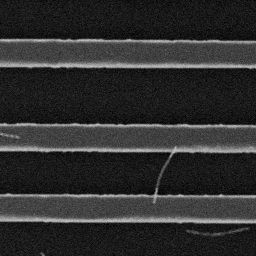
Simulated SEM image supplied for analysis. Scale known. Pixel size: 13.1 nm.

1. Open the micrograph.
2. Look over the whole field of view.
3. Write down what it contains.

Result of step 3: lines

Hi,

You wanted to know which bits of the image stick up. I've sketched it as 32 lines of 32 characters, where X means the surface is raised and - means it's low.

--------------------------------
--------------------------------
--------------------------------
--------------------------------
--------------------------------
XXXXXXXXXXXXXXXXXXXXXXXXXXXXXXXX
XXXXXXXXXXXXXXXXXXXXXXXXXXXXXXXX
XXXXXXXXXXXXXXXXXXXXXXXXXXXXXXXX
--------------------------------
--------------------------------
--------------------------------
--------------------------------
--------------------------------
--------------------------------
--------------------------------
X-XXX----X--X-------------------
XXXXXXXXXXXXXXXXXXXXXXXXXXXXXXXX
XXXXXXXXXXXXXXXXXXXXXXXXXXXXXXXX
XXXXXXXXXXXXXXXXXXXXXXXXXXXXXXXX
--------------------------------
--------------------------------
--------------------------------
--------------------------------
--------------------------------
XXXXXXXXXXXXXXXXXXXXXXXXXXXXXXXX
XXXXXXXXXXXXXXXXXXXXXXXXXXXXXXXX
XXXXXXXXXXXXXXXXXXXXXXXXXXXXXXXX
XXXXXXXXXXXXXXXXXXXXXXXXXXXXXXXX
--------------------------------
--------------------------------
--------------------------------
--------------------------------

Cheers